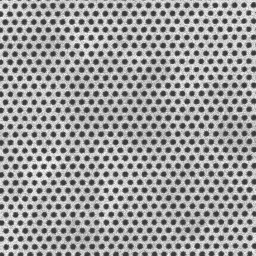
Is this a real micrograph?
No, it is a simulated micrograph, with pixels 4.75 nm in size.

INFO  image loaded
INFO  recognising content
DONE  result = a regular array of holes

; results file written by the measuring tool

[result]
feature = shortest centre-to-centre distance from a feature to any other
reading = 0.0432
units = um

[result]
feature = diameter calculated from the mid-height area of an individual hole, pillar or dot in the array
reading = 27.8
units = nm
